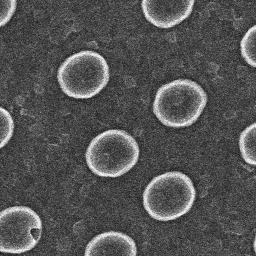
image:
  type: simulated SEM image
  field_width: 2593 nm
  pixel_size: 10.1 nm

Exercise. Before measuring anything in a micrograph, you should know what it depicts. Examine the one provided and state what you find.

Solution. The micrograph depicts raised bodies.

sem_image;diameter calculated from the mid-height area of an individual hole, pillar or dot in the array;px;46.6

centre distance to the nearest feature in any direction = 785 nm